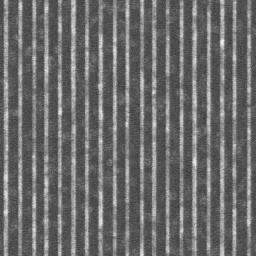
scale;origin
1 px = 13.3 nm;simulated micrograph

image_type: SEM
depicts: parallel lines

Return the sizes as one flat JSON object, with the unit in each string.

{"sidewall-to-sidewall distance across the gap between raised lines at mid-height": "0.137 micrometres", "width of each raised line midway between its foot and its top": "40 nm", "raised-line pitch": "180 nanometers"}